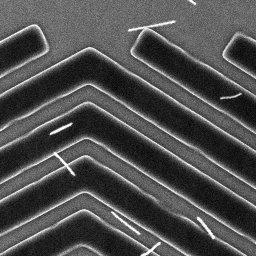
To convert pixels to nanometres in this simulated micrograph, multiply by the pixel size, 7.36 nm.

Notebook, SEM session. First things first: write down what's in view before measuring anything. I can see groups of lines, slits or small figures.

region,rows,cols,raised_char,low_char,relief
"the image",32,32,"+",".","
................................
................................
................................
...++...........................
.++++............+++.........++.
++++++...........++++........+++
++++++....+++...+++++++.....++++
++++....++++++....+++++++...++++
++....+++++++++....+++++++....++
....+++++++++++++....+++++++...+
..+++++++++++++++++...++++++++..
.++++++++....+++++++....+++++++.
+++++++.......++++++++...+++++++
+++++....++++...+++++++....+++++
+++.....++++++....+++++++....+++
+.....++++++++++...++++++++...++
....+++++++++++++....+++++++....
..++++++++.++++++++...++++++++..
++++++++.....+++++++....+++++++.
+++++++...+....+++++++....++++++
+++++...+++++...++++++++...+++++
+++....+++++++....+++++++....+++
+....+++++++++++...++++++++...++
...++++++++++++++....+++++++....
.+++++++++..+++++++....+++++++..
++++++++.....+++++++....++++++++
++++++....+....+++++++....++++++
++++....+++++...++++++++...+++++
++....++++++++....+++++++....+++
....++++++++++++....+++++++....+
..++++++++++++++++...+++++++....
.++++++++...+++++++....+++++++..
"